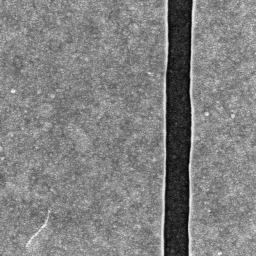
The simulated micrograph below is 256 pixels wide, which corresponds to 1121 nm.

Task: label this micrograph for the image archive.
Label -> one or a few lines or trenches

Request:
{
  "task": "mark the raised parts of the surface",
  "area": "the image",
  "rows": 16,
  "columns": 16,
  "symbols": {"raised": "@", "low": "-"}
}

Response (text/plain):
@@@@@@@@@@--@@@@
@@@@@@@@@@--@@@@
@@@@@@@@@@--@@@@
@@@@@@@@@@--@@@@
@@@@@@@@@@--@@@@
@@@@@@@@@@--@@@@
@@@@@@@@@@--@@@@
@@@@@@@@@@--@@@@
@@@@@@@@@@--@@@@
@@@@@@@@@@--@@@@
@@@@@@@@@@--@@@@
@@@@@@@@@@--@@@@
@@@@@@@@@@--@@@@
@@@@@@@@@@--@@@@
@@@@@@@@@@--@@@@
@@@@@@@@@@--@@@@